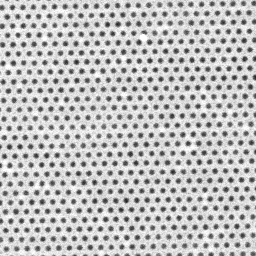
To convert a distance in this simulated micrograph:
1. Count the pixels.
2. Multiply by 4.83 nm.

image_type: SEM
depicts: a regular array of holes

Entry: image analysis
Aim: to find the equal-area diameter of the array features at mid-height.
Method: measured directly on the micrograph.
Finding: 32.3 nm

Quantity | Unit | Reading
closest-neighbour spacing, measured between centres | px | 10.2